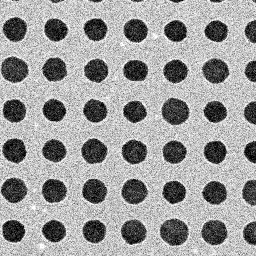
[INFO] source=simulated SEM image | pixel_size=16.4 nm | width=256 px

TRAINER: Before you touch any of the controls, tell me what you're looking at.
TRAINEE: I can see a regular array of holes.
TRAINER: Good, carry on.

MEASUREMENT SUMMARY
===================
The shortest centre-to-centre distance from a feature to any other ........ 650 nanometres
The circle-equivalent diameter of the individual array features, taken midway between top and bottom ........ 404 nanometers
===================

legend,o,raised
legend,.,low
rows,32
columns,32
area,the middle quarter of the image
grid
.oooo......oooo......oooo......o
.oooo......oooo......oooo......o
.oooo......oooo......oooo......o
oooooo.....oooo.....ooooo......o
ooooooo..ooooooooooooooooo....oo
oooooooooooooooooooooooooooooooo
oooooooooooooooooooooooooooooooo
oooooooooooooooooooooooooooooooo
oooooooooooooooooooooooooo..oooo
oooooo...ooooooo...oooooo.....oo
ooooo......oooo.....oooo.......o
.oooo......oooo......ooo.......o
ooooo......oooo......ooo.......o
ooooo......oooo.....ooooo......o
oooooo...oooooooo..ooooooo....oo
oooooooooooooooooooooooooooooooo
oooooooooooooooooooooooooooooooo
oooooooooooooooooooooooooooooooo
ooooooo.oooooooooooooooooooooooo
ooooo.....oooooo...ooooooo...ooo
ooooo......oooo......oooo.....oo
.ooo.......ooo.......ooo.......o
.ooo.......ooo.......oooo......o
ooooo.....ooooo.....ooooo.....oo
oooooo...ooooooo....oooooo...ooo
oooooooooooooooooooooooooooooooo
oooooooooooooooooooooooooooooooo
oooooooooooooooooooooooooooooooo
ooooooo.oooooooooooooooooooooooo
ooooo.....ooooo.....oooooo...ooo
.oooo.....ooooo.....ooooo.....oo
.ooo.......ooo.......oooo......o